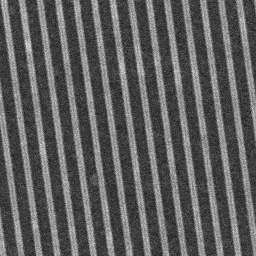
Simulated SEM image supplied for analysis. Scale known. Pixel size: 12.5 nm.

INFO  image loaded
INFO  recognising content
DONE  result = parallel lines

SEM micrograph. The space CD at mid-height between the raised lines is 0.172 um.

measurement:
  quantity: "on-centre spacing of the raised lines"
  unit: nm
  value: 225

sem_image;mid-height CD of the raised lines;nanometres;52.8